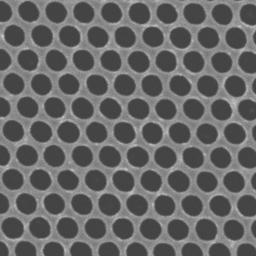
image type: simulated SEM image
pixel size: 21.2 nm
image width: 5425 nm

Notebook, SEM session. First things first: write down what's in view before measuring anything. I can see a regular array of holes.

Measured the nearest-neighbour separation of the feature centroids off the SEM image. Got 578 nanometers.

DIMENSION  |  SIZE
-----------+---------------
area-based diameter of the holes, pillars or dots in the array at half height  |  463 nanometres